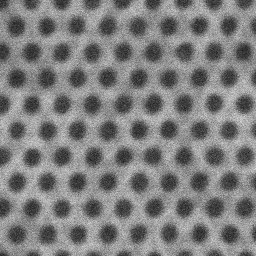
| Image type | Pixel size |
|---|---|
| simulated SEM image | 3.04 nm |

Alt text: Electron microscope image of a regular array of holes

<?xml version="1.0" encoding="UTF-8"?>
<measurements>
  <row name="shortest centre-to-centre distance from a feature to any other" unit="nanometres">90.2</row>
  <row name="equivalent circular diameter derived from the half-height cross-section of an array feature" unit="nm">57.6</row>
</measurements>